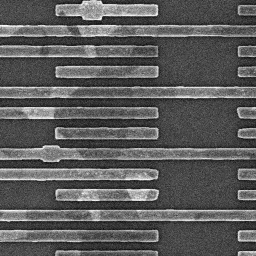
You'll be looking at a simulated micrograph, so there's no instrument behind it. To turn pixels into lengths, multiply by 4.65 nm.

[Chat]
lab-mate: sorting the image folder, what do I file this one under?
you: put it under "wiring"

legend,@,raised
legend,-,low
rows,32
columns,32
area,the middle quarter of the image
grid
--------------------------------
@@@@@@@@@@@@@@@@@@@@@@@---------
@@@@@@@@@@@@@@@@@@@@@@@---------
--------------------------------
--------------------------------
--------------------------------
@@@@@@@@@@@@@@@@@@@@@@@@@@@@@@@@
@@@@@@@@@@@@@@@@@@@@@@@@@@@@@@@@
--------------------------------
--------------------------------
--------------------------------
@@@@@@@@@@@@@@@@@@@@@@@---------
@@@@@@@@@@@@@@@@@@@@@@@---------
--------------------------------
--------------------------------
--------------------------------
@@@@@@@@@@@@@@@@@@@@@@@---------
@@@@@@@@@@@@@@@@@@@@@@@---------
@@@@@@@@@@@@@@@@@@@@@@@---------
--------------------------------
--------------------------------
@@@@@@@@@@@@@@@@@@@@@@@@@@@@@@@@
@@@@@@@@@@@@@@@@@@@@@@@@@@@@@@@@
@@@@@@@@@@@@@@@@@@@@@@@@@@@@@@@@
--------------------------------
--------------------------------
@@@@@@@@@@@@@@@@@@@@@@@---------
@@@@@@@@@@@@@@@@@@@@@@@---------
@@@@@@@@@@@@@@@@@@@@@@@---------
--------------------------------
--------------------------------
--------------------------------